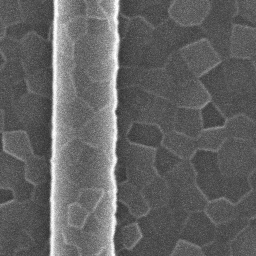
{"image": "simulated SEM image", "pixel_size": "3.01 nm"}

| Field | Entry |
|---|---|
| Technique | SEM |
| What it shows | one or a few lines or trenches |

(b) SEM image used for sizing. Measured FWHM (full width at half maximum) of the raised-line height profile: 187 nm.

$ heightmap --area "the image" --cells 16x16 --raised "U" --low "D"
DDDUUUUDDDDDDDDD
DDDUUUUDDDDDDDDD
DDDUUUUDDDDDDDDD
DDDUUUUDDDDDDDDD
DDDUUUUDDDDDDDDD
DDDUUUUDDDDDDDDD
DDDUUUUDDDDDDDDD
DDDUUUUDDDDDDDDD
DDDUUUUDDDDDDDDD
DDDUUUUDDDDDDDDD
DDDUUUUDDDDDDDDD
DDDUUUUDDDDDDDDD
DDDUUUUDDDDDDDDD
DDDUUUUDDDDDDDDD
DDDUUUUDDDDDDDDD
DDDUUUUDDDDDDDDD